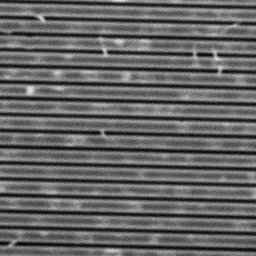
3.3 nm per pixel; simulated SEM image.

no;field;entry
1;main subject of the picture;parallel lines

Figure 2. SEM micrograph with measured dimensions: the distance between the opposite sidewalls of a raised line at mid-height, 38 nm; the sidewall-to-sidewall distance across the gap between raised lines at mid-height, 14.9 nanometres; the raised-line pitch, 0.0534 µm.